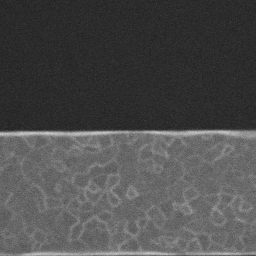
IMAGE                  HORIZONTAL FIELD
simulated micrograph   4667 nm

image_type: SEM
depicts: wiring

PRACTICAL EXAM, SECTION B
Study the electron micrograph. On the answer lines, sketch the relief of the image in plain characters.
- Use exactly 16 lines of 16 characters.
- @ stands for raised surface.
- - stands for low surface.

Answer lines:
----------------
----------------
----------------
----------------
----------------
----------------
----------------
----------------
@@@@@@@@@@@@@@@@
@@@@@@@@@@@@@@@@
@@@@@@@@@@@@@@@@
@@@@@@@@@@@@@@@@
@@@@@@@@@@@@@@@@
@@@@@@@@@@@@@@@@
@@@@@@@@@@@@@@@@
@@@@@@@@@@@@@@@@